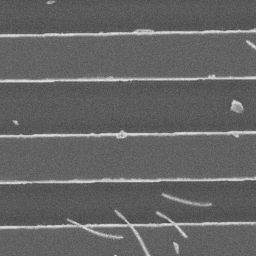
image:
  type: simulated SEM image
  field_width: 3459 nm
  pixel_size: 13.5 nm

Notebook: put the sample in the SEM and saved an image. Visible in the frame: lines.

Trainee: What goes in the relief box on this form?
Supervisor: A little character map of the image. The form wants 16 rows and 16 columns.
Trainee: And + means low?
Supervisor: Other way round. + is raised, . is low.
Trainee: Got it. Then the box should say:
................
................
++++++++++++++++
++++++++++++++++
++++++++++++++++
................
................
................
++++++++++++++++
++++++++++++++++
++++++++++++++++
................
................
................
++++++++++++++++
++++++++++++++++